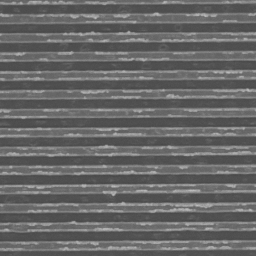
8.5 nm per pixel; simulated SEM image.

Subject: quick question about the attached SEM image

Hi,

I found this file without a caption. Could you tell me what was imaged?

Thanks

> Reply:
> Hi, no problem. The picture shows parallel lines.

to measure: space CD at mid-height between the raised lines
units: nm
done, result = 82.9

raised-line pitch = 161 nanometres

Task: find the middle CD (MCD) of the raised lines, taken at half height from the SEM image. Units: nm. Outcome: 75.5